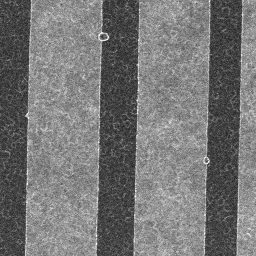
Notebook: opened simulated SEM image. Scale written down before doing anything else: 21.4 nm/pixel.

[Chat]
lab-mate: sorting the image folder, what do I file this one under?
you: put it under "one or a few lines or trenches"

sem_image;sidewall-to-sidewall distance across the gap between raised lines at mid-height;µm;1.5